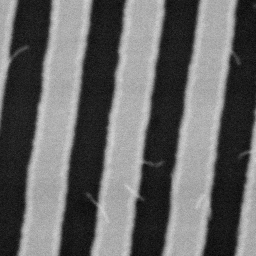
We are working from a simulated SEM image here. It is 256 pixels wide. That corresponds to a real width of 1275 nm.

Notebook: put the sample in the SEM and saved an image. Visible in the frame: lines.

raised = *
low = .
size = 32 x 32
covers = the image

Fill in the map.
**.....****.....****.....*****..
**....*****.....****.....****...
**....*****....*****.....****...
*.....*****....*****.....****...
*.....*****....*****....*****...
*.....*****....*****....*****...
*.....*****....*****....*****...
*.....****.....*****....*****...
*.....****.....****.....****....
*....*****.....****.....****....
*....*****.....****....*****....
.....*****....*****....*****....
.....*****....*****....*****....
.....*****....*****....*****....
.....*****....*****....*****....
.....****.....*****....****.....
.....****.....****.....****.....
....*****....*****....*****.....
....*****....*****....*****....*
....*****....*****....*****....*
....*****....*****....*****....*
....****.....*****....*****....*
...*****.....*****....*****....*
...*****.....****....*****.....*
...*****....*****....*****.....*
...*****....*****....*****....**
...*****....*****....*****....**
...*****....*****....*****....**
...*****....*****....*****....**
...*****....****.....*****....**
...****.....****.....*****....**
..*****....*****....*****.....**